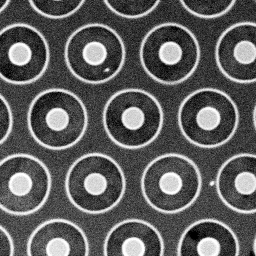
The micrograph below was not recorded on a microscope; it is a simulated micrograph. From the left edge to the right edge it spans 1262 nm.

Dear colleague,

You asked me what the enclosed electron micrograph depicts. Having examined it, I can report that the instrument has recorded an array of small figures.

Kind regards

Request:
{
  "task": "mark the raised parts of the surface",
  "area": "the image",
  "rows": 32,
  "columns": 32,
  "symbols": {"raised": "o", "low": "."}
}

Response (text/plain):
.ooo......oooo.....oooo......ooo
ooooo....oooooo...oooooo....oooo
oooooooooooooooooooooooooooooooo
o...ooooooo..ooooooo...oooooo...
.....oooo......oooo.....oooo....
......ooo..o...ooo...o..ooo...o.
.ooo..oo...oo..ooo..ooo..oo..ooo
..o...oo...oo..ooo..oo...oo...oo
.....oooo......ooo......oooo....
.....ooooo....ooooo....oooooo...
oooooooooooooooooooooooooooooooo
oooooo..oooooooo..ooooooo..ooooo
ooooo.....oooo.....oooo......ooo
.ooo......ooo.......ooo......ooo
.ooo..oo...oo..ooo..oo...oo...oo
.ooo..oo...oo...oo..ooo..oo..ooo
.ooo......oooo......ooo......ooo
ooooo.....oooo.....ooooo....oooo
oooooooooooooooooooooooooooooooo
ooooooooooo..oooooooo.oooooooo.o
.....oooo.....ooooo.....oooo....
......ooo......ooo.......ooo....
.ooo..ooo..oo..ooo..oo...oo...oo
.ooo..oo...oo..ooo..oo...oo...oo
......ooo......ooo......oooo....
.....ooooo....ooooo.....ooooo...
oo.ooooooooooooooooooooooooooooo
oooooooooooooooooooooooooooooooo
ooooo.....oooo.....ooooo....oooo
.ooo......oooo......ooo......ooo
.ooo..oo...oo...oo..ooo..oo...oo
.ooo..oo...oo...oo..oo...oo...oo